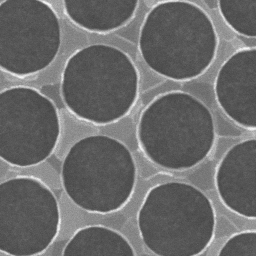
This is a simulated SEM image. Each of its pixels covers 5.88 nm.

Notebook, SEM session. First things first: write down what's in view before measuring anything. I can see holes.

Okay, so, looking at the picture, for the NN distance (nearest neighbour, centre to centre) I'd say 89.1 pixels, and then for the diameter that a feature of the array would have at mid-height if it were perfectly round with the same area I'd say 449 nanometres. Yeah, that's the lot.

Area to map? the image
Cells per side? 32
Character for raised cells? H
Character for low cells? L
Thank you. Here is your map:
LLLLLLHHLLLLLLLLLHHHLLLLHHHLLLLL
LLLLLLLHLLLLLLLLLHHLLLLLLHHHLLLL
LLLLLLLHHLLLLLLLHHLLLLLLLLHHLLLL
LLLLLLLHHHHLLLHHHHLLLLLLLLLHHLLL
LLLLLLLLHHHHHHHHHHLLLLLLLLLHHHHH
LLLLLLLHHHHHHHHHHHLLLLLLLLLHHHHH
LLLLLLLHHHLLLLLHHHLLLLLLLLLHHHLL
LLLLLLLHHLLLLLLLHHLLLLLLLLHHHLLL
HLLLLLHHLLLLLLLLLHHLLLLLLLHHLLLL
HHHHHHHHLLLLLLLLLHHHHLLLHHHLLLLL
HHHHHHHHLLLLLLLLLHHHHHHHHHHLLLLL
LLLLLHHHLLLLLLLLLHHHHHHHHHHLLLLL
LLLLLLHHLLLLLLLLLHHHLLLLLHHLLLLL
LLLLLLLHHLLLLLLLHHLLLLLLLLHHLLLL
LLLLLLLHHHLLLLLHHHLLLLLLLLHHHLLL
LLLLLLLHHHHHHHHHHLLLLLLLLLLHHHLL
LLLLLLLHHHHHHHHHHLLLLLLLLLLHHHHH
LLLLLLLHHHLLLLHHHHLLLLLLLLLHHHHL
LLLLLLLHHLLLLLLLHHLLLLLLLLHHHLLL
LLLLLLHHLLLLLLLLHHHLLLLLLLHHLLLL
HHLLLHHHLLLLLLLLLHHHLLLLLHHHLLLL
HHHHHHHHLLLLLLLLLHHHHHHHHHHLLLLL
HLLLHHHHLLLLLLLLLHHHHHHHHHHLLLLL
LLLLLLHHLLLLLLLLLHHLLLLLHHHLLLLL
LLLLLLLHHLLLLLLLHHLLLLLLLLHHLLLL
LLLLLLLHHHLLLLLHHHLLLLLLLLHHLLLL
LLLLLLLHHHHHHHHHHLLLLLLLLLLHHHLL
LLLLLLLHHHHHHHHHHLLLLLLLLLLHHHHH
LLLLLLLHHHHLLHHHHLLLLLLLLLLHHHHH
LLLLLLLHHLLLLLLHHHLLLLLLLLHHHLLL
LLLLLLHHHLLLLLLLHHLLLLLLLLHHLLLL
HLLLLHHHLLLLLLLLLHHLLLLLLHHHLLLL